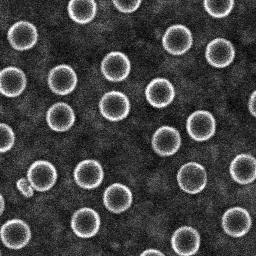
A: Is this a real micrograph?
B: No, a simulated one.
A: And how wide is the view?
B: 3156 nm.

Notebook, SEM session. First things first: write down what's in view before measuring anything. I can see a regular array of raised bodies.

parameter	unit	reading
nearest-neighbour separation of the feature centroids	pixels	40.4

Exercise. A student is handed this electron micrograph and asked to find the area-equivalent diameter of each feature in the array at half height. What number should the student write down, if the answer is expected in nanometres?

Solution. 340